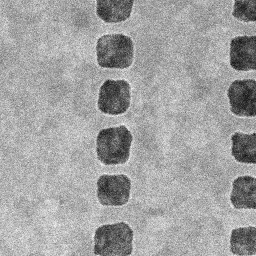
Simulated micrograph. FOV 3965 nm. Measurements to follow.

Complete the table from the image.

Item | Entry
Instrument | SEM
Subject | holes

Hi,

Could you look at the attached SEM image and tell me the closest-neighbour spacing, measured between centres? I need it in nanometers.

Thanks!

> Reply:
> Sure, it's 697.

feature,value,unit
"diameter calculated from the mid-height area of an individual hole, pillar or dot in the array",37.7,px